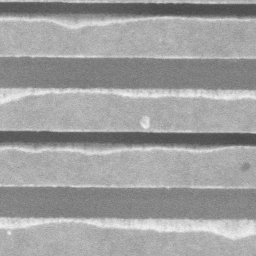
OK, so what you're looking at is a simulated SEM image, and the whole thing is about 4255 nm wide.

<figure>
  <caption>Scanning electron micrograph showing lines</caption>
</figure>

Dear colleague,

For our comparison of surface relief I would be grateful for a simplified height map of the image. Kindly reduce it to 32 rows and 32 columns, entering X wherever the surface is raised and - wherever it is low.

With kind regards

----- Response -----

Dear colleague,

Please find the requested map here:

--------------------------------
--------------------------------
XXXXXXXX--XXXXXXXXXXXXXXXXXXXXXX
XXXXXXXXXXXXXXXXXXXXXXXXXXXXXXXX
XXXXXXXXXXXXXXXXXXXXXXXXXXXXXXXX
XXXXXXXXXXXXXXXXXXXXXXXXXXXXXXXX
XXXXXXXXXXXXXXXXXXXXXXXXXXXXXXXX
--------------------------------
--------------------------------
--------------------------------
--------------------------------
---XXXXXXXXXXXX-----------------
XXXXXXXXXXXXXXXXXXXXXXXXXXXXXXXX
XXXXXXXXXXXXXXXXXXXXXXXXXXXXXXXX
XXXXXXXXXXXXXXXXXXXXXXXXXXXXXXXX
XXXXXXXXXXXXXXXXXXXXXXXXXXXXXXXX
------------------XXXXXXXXXXXXXX
--------------------------------
XXXXXXXXXX----XXXXXXXXXX--XXXXXX
XXXXXXXXXXXXXXXXXXXXXXXXXXXXXXXX
XXXXXXXXXXXXXXXXXXXXXXXXXXXXXXXX
XXXXXXXXXXXXXXXXXXXXXXXXXXXXXXXX
XXXXXXXXXXXXXXXXXXXXXXXXXXXXXXXX
--------------------------------
--------------------------------
--------------------------------
--------------------------------
------XXXX----------------------
XXXXXXXXXXXXXXXXXXXXXXXXXXXXX-XX
XXXXXXXXXXXXXXXXXXXXXXXXXXXXXXXX
XXXXXXXXXXXXXXXXXXXXXXXXXXXXXXXX
XXXXXXXXXXXXXXXXXXXXXXXXXXXXXXXX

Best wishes